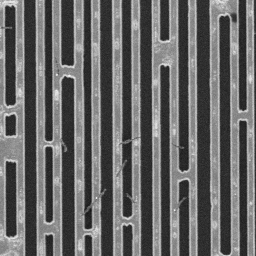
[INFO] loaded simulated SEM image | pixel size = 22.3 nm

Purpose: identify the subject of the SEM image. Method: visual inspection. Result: parallel lines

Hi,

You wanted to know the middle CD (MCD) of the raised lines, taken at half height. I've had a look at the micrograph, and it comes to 162 nm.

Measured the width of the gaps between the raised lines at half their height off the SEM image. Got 262 nm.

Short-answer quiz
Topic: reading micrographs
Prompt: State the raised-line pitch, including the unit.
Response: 427 nm